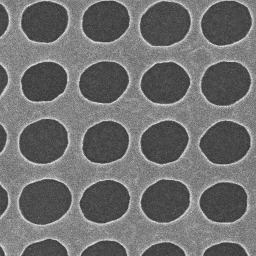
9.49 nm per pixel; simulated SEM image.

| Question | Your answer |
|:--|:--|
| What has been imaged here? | a regular array of holes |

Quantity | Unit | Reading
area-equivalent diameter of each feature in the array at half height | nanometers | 435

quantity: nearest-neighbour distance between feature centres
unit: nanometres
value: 564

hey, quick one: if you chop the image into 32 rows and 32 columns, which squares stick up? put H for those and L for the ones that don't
HHHHLLLHHHHHLLLHHHHLLLHHHHHLLLHH
LHHLLLLLHHHLLLLLHHLLLLLLHHLLLLLH
LHHLLLLLLHLLLLLLHHLLLLLLHLLLLLLH
LHHLLLLLHHLLLLLLHLLLLLLLHLLLLLLH
HHHLLLLLHHHLLLLHHHLLLLLHHHLLLLLH
HHHHHHHHHHHHHHHHHHHLLLHHHHHLLHHH
HHHHHHHHHHHHHHHHHHHHHHHHHHHHHHHH
HHHHHHHHHHHHHHHHHHHHHHHHHHHHHHHH
HHHHLLLLHHHLLLLHHHHLLLLHHHLLLLLH
LHHLLLLLHHLLLLLLHHLLLLLLHLLLLLLH
LHHLLLLLHHLLLLLLHHLLLLLLHLLLLLLH
HHHLLLLLHHLLLLLHHHLLLLLHHLLLLLLH
HHHHLLHHHHHLLLLHHHHLLLHHHHLLLLHH
HHHHHHHHHHHHHHHHHHHHHHHHHHHHHHHH
HHHHHHHHHHHHHHHHHHHHHHHHHHHHHHHH
HHHHLLLLHHHHLLLHHHHLLLHHHHHLLLHH
LHHLLLLLHHHLLLLLHHLLLLLHHHLLLLLH
LHLLLLLLLHLLLLLLHHLLLLLLHLLLLLLH
HHLLLLLLHHLLLLLLHHLLLLLHHLLLLLLH
HHHLLLLLHHHLLLLHHHLLLLLHHHLLLLLH
HHHHHHHHHHHHHHHHHHHHLHHHHHHHLHHH
HHHHHHHHHHHHHHHHHHHHHHHHHHHHHHHH
HHHHHLLHHHHHHLHHHHHHLHHHHHHHHHHH
HHHLLLLLLHHLLLLLHHLLLLLHHHLLLLHH
LHHLLLLLLHLLLLLLHHLLLLLLHLLLLLLH
LHLLLLLLLHLLLLLLHHLLLLLLHLLLLLLH
HHHLLLLLHHLLLLLLHHLLLLLHHLLLLLLH
HHHLLLLHHHHLLLHHHHHLLLHHHHLLLLHH
HHHHHHHHHHHHHHHHHHHHHHHHHHHHHHHH
HHHHHHHHHHHHHHHHHHHHHHHHHHHHHHHH
HHHHLLLLHHHHLLLHHHHLLLHHHHHLLLHH
HHHLLLLLHHLLLLLLHHLLLLLHHHLLLLLH